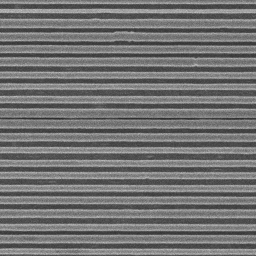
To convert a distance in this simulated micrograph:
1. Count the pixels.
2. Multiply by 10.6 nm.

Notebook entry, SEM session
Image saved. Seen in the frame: parallel lines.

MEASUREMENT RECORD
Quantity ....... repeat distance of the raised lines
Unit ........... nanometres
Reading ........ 134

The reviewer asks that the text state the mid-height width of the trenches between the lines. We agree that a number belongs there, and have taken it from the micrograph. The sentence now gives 56.9 nanometers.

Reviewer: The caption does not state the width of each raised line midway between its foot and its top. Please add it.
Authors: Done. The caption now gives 0.0768 um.